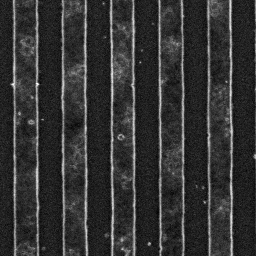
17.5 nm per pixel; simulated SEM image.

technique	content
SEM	parallel lines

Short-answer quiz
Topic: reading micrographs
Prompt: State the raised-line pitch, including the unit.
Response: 48.5 px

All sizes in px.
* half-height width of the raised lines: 23.1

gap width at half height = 0.45 micrometres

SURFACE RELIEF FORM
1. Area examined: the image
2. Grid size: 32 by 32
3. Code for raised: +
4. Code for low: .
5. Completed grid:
..+++...+++...+++...+++...+++...
..+++...+++...+++...+++...+++...
..+++...+++...+++...+++...+++...
..+++...+++...+++...+++...+++...
..+++...+++...+++...+++...+++...
..+++...+++...+++...+++...+++...
..+++...+++...+++...+++...+++...
..+++...+++...+++...+++...+++...
..+++...+++...+++...+++...+++...
..+++...+++...+++...+++...+++...
..+++...+++...+++...+++...+++...
..+++...+++...+++...+++...+++...
..+++...+++...+++...+++...+++...
..+++...+++...+++...+++...+++...
..+++...+++...+++...+++...+++...
..+++...+++...+++...+++...+++...
..+++...+++...+++...+++...+++...
..+++...+++...+++...+++...+++...
..+++...+++...+++...+++...+++...
..+++...+++...+++...+++...+++...
..+++...+++...+++...+++...+++...
..+++...+++...+++...+++...+++...
..+++...+++...+++...+++...+++...
..+++...+++...+++...+++...+++...
..+++...+++...+++...+++...+++...
..+++...+++...+++...+++...+++...
..+++...+++...+++...+++...+++...
..+++...+++...+++...+++...+++...
..+++...+++...+++...+++...+++...
..+++...+++...+++...+++...+++...
..+++...+++...+++...+++...+++...
..+++...+++...+++...+++...+++...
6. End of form